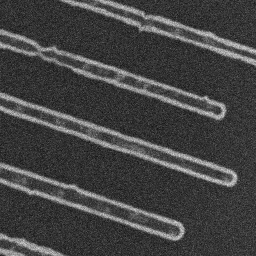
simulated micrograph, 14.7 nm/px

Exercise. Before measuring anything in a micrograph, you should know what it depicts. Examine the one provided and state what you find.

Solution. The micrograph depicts one or a few lines or trenches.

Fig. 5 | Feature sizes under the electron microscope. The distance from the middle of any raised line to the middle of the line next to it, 928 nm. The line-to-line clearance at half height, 735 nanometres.